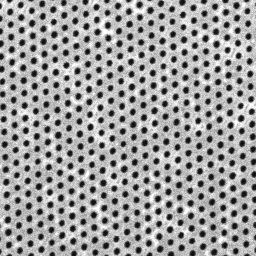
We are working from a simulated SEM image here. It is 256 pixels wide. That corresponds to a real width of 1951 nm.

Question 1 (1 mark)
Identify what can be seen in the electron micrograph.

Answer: a regular array of holes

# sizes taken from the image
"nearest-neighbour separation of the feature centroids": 93.5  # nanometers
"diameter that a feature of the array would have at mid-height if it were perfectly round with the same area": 0.0509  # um